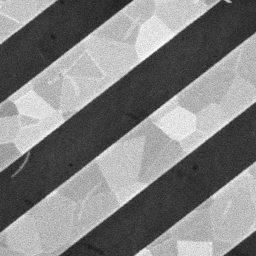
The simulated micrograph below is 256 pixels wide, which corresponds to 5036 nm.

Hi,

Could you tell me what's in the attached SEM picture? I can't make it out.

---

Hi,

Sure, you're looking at lines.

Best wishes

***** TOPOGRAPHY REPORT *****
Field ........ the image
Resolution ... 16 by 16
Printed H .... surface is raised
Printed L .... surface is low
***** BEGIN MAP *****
HHHLLLLLHHHHHLLL
HHLLLLHHHHHHLLLL
LLLLLHHHHHHLLLLH
LLLLHHHHHLLLLLHH
LLLHHHHHLLLLLHHH
LHHHHHHLLLLLHHHH
HHHHHLLLLLHHHHHH
HHHHLLLLLHHHHHHL
HHHLLLLLHHHHHLLL
HHLLLLHHHHHHLLLL
LLLLLHHHHHHLLLLH
LLLLHHHHHLLLLLHH
LLLHHHHHLLLLLHHH
LHHHHHHLLLLLHHHH
HHHHHHLLLLHHHHHH
HHHHLLLLLHHHHHHL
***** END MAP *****